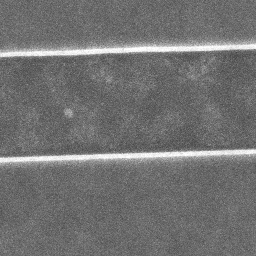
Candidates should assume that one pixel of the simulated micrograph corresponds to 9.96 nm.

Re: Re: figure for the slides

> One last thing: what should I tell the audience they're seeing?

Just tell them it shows one or a few lines or trenches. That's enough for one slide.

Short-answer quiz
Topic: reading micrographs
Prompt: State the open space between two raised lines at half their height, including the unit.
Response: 1050 nanometres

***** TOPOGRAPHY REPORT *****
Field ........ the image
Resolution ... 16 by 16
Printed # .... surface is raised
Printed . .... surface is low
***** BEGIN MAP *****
################
################
################
................
................
................
................
................
................
...............#
################
################
################
################
################
################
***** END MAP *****